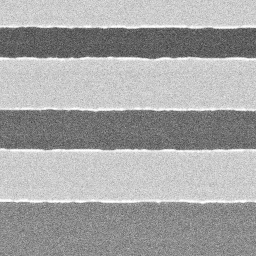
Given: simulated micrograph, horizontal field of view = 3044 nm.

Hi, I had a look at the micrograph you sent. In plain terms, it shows lines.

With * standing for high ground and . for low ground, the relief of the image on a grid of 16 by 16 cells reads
****************
****************
................
................
****************
****************
****************
................
................
****************
****************
****************
****************
................
................
................